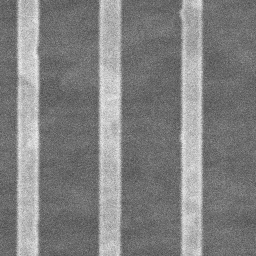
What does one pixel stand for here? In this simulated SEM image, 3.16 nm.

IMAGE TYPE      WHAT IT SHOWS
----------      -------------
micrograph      one or a few lines or trenches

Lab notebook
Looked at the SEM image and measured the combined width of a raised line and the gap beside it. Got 258 nm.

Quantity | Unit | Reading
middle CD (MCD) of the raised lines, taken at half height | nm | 58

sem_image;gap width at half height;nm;198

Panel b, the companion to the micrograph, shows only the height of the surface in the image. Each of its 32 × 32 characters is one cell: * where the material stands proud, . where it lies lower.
..***........**........**.......
..***........**........**.......
..***........**........**.......
..***........**........**.......
..***........**........**.......
..***........**........**.......
..***........**........**.......
..***........**........**.......
..***........**........**.......
..***........**........**.......
..***........**........**.......
..***........**........**.......
..***........**........**.......
..***........**........**.......
..***........**........**.......
..***........**........**.......
..***........**........**.......
..***........**........**.......
..***........**........**.......
..***........**........**.......
..***........**........**.......
..***........**........**.......
..***........**........**.......
..***........**........**.......
..***........**........**.......
..***........**........**.......
..***........**........**.......
..***........**........**.......
..***........**........**.......
..***........**........**.......
..***........**........**.......
..***........**........**.......